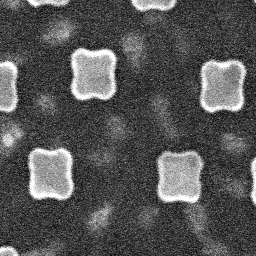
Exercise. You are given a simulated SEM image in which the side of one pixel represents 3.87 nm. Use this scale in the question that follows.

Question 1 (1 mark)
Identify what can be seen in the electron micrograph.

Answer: raised bodies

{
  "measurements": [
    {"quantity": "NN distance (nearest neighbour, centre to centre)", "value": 404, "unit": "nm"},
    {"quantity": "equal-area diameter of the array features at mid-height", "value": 0.189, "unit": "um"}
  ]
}